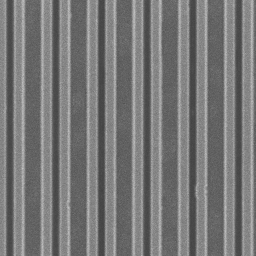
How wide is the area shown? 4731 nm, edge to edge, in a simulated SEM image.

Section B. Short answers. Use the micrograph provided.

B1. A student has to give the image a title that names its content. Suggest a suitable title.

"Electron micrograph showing parallel lines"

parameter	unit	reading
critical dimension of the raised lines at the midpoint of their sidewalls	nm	187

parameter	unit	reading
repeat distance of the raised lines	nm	422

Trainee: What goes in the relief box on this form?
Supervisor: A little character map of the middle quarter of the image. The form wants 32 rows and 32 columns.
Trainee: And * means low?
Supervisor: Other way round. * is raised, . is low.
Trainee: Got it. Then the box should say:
*.....**...**....***..**.....**.
*.....**...**....***..**.....**.
*.....**...**....***..**.....**.
*.....**..***....***..**.....**.
*.....**..***....***..**.....**.
*.....**..***....***..**.....**.
*.....**..***....***..**.....**.
*.....**..***....***..**.....**.
*.....**..***....***..**.....**.
*.....**..***....***..**.....**.
*.....**..***....***..**.....**.
*.....**..***....***..**.....**.
*.....**..***....***..**.....**.
*.....**..***....***..**.....**.
*.....**..***....***..**.....**.
*.....**..***....***..**.....**.
*.....**..***....***..**.....**.
*.....**..***....***..**.....**.
*.....**..***....***..**.....**.
*.....**..***....***..**.....**.
*.....**..***....***..**.....**.
*.....**..***....***..**.....**.
*.....**..***....***..**.....**.
*.....**..***....***..**.....**.
*.....**..***....***..**.....**.
*.....**..***....***..**.....**.
*.....**..***....***..**.....**.
*.....**..***....***..**.....**.
*.....**..***....***..**.....**.
*.....**..***....***..**.....**.
*.....**..***....***..**.....**.
*.....**..***....***..**.....**.